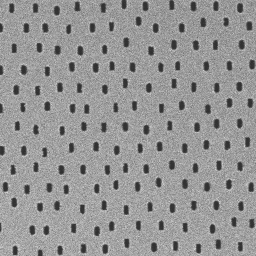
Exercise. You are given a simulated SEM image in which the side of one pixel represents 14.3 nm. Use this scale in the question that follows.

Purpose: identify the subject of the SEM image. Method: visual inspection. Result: a regular array of holes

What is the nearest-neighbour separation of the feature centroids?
276 nm